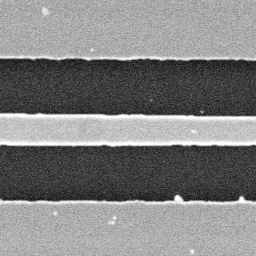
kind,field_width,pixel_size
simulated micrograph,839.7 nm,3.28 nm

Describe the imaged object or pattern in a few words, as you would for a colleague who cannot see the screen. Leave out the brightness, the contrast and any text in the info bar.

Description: lines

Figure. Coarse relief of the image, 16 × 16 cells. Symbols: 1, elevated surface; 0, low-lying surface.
1111111111111111
1111111111111111
1111111111111111
1111111111111111
0000000000000000
0000000000000000
0000000000000000
1111111111111111
1111111111111111
0000000000000000
0000000000000000
0000000000000000
0000000000000000
1111111111111111
1111111111111111
1111111111111111